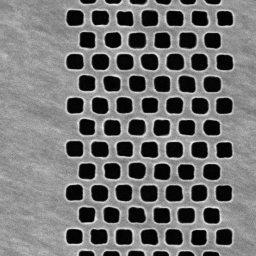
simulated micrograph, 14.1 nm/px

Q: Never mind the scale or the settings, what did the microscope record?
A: a regular array of holes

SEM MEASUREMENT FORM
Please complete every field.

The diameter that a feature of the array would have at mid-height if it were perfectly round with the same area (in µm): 0.246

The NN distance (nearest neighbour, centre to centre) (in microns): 0.346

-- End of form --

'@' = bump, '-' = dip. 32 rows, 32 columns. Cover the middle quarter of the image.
@----@@----@@----@@@----@@----@@
@@@@@@@@@-@@@@--@@@@@--@@@@--@@@
@@@@@@@@@@@@@@@@@@@@@@@@@@@@@@@@
@@@@----@@----@@----@@@---@@@---
@@@@----@@----@@----@@-----@@---
@@@@----@@----@@----@@@----@@---
@@@@----@@----@@@---@@@---@@@---
@@@@@@@@@@@@@@@@@@@@@@@@@@@@@@@@
@@--@@@@-@@@@---@@@@---@@@@--@@@
@----@@----@@----@@-----@@----@@
@----@@----@@----@@-----@-----@@
@----@@----@@----@@----@@@----@@
@@@@@@@@--@@@@-@@@@@@@@@@@@@-@@@
@@@@@@@@@@@@@@@@@@@@@@@@@@@@@@@@
@@@@----@@----@@----@@@---@@@---
@@@@----@@----@@----@@----@@@---
@@@@----@@----@@----@@----@@@---
@@@@@--@@@----@@----@@@---@@@---
@@@@@@@@@@@@@@@@@@@@@@@@@@@@@@@@
@---@@@@--@@@@---@@@---@@@@-@@@@
-----@@----@@----@@-----@@----@@
-----@@----@@----@@-----@-----@@
@----@@----@@----@@-----@@----@@
@@@@@@@@@@@@@@@@@@@@@@@@@@@@@@@@
@@@@@@@@@@@@@@@@@@@@@@@@@@@@@@@@
@@@@----@@----@@----@@@---@@@---
@@@@----@@----@@-----@-----@----
@@@@----@@----@@----@@-----@@---
@@@@---@@@@---@@@---@@@---@@@---
@@@@@@@@@@@@@@@@@@@@@@@@@@@@@@@@
@---@@@---@@@---@@@@---@@@---@@@
@----@@----@@----@@-----@-----@@